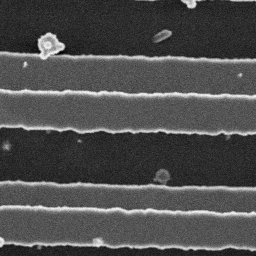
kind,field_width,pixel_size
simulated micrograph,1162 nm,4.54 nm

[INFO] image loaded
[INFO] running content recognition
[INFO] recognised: lines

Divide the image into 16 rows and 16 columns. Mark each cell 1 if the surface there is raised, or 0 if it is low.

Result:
0000000000000000
0000000000000000
0001000000000000
1111000000000000
1111111111111111
1111111111111111
1111111111111111
1111111111111111
0000000000000000
0000000000000000
0000000000000000
1111000000000000
1111111111111111
1111111111111111
1111111111111111
0000000000011101